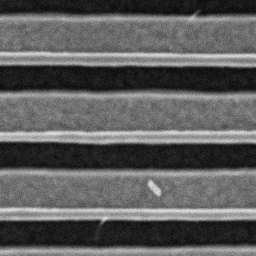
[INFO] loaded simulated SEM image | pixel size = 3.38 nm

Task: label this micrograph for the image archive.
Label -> lines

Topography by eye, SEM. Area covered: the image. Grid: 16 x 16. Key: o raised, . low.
................
oooooooooooooooo
oooooooooooooooo
oooooooooooooooo
................
................
oooooooooooooooo
oooooooooooooooo
oooooooooooooooo
................
................
oooooooooooooooo
oooooooooooooooo
oooooooooooooooo
................
................